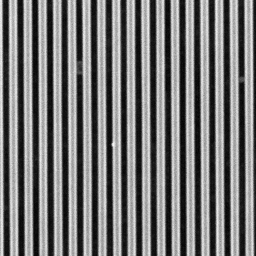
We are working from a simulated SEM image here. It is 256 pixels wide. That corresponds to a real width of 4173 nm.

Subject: parallel lines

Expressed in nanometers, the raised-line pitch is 240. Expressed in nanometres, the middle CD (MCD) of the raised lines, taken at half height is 134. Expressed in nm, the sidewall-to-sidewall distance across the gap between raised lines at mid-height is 104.